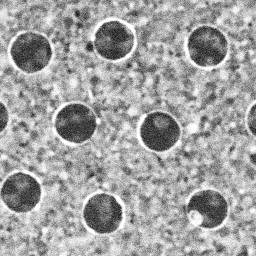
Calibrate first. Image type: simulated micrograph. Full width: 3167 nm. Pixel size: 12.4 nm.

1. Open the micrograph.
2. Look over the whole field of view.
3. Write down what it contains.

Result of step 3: holes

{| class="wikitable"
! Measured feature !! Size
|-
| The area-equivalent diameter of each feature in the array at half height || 514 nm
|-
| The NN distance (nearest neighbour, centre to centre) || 1040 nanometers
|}